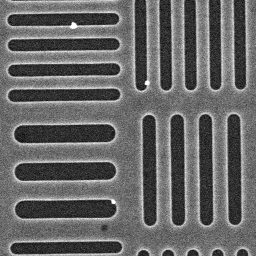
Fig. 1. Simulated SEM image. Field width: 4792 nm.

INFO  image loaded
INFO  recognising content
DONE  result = groups of lines, slits or small figures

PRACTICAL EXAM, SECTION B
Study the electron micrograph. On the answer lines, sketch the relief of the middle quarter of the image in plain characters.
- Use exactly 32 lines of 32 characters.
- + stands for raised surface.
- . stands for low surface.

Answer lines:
..............++++...+++...+++..
..............++++...+++...+++..
..............++++...+++...+++..
++++++++++++++++++...+++...+++..
++++++++++++++++++..++++...+++..
++++++++++++++++++...+++...+++..
..............++++..+++++.+++++.
..............++++++++++++++++++
..............++++++++++++++++++
++++++++++++++++++++++++++++++++
++++++++++++++++++++++++++++++++
++++++++++++++++++++++++++++++++
++++++++++++++++++++++++++++++++
++++++++++++++++++++...++++...++
+++++++++++++++++++....+++....++
............+++++++....+++....++
.............++++++....+++....++
.............++++++....+++....++
.............++++++....+++....++
...........++++++++....+++....++
+++++++++++++++++++....+++....++
+++++++++++++++++++....+++....++
+++++++++++++++++++....++++...++
+++++++++++++++++++....++++...++
...........++++++++....++++...++
.............++++++....++++...++
.............++++++....++++...++
.............++++++....++++...++
............++++++++...++++...++
++++++++++++++++++++...++++...++
++++++++++++++++++++...++++...++
++++++++++++++++++++...++++...++